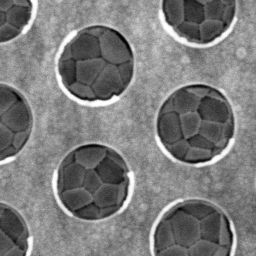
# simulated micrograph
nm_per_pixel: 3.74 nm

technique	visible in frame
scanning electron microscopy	holes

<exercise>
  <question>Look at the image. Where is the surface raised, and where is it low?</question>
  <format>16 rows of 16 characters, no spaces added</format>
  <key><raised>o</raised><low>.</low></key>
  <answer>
..oooooooo.....o
..ooooooooo...oo
.ooo....oooo.ooo
oooo....oooooooo
oooo....oooooooo
.ooo....ooo..ooo
..oooooooo....oo
..oooooooo.....o
..oooooooo.....o
.ooo...oooo...oo
oooo....oooooooo
oooo....oooooooo
oooo....oooo.ooo
.oooo..ooo....oo
..oooooooo....oo
..oooooooo....oo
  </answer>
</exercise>